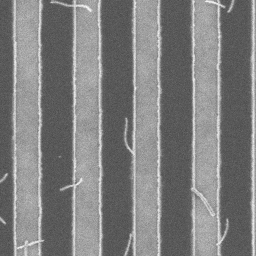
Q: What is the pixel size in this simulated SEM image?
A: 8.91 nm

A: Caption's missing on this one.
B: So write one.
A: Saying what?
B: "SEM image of lines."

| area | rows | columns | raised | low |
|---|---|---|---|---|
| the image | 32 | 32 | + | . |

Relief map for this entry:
++...++++...+++++...++++...+++++
++...++++...+++++...++++...+++++
++...++++...+++++...++++...+++++
++...++++...+++++...++++...+++++
++...++++...+++++...++++...+++++
++...++++...+++++...++++...+++++
++...++++...+++++...++++...+++++
++...++++...+++++...++++...+++++
++...++++....++++...++++...+++++
++...++++...+++++...++++...+++++
++...++++...+++++...++++...+++++
++...++++...+++++...++++...+++++
++...++++...+++++...++++...+++++
++...++++...+++++...++++...+++++
++...++++....++++...++++...+++++
++...++++....++++...++++...+++++
++...++++....++++...++++...+++++
++...++++...+++++...++++...+++++
++...++++....++++...++++...+++++
++...++++...+++++...++++...+++++
++...++++....++++...++++...+++++
++...++++....++++...++++...+++++
++...++++....++++...++++...+++++
++...++++....++++...++++...+++++
++...++++....++++...+++++..+++++
++...++++...+++++...++++...+++++
++...++++....++++...++++...+++++
++...++++....++++...++++...+++++
++...++++....++++...++++...+++++
++...++++....++++...++++...+++++
++...++++....++++...++++...+++++
++...++++....++++...++++...+++++